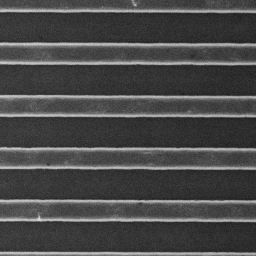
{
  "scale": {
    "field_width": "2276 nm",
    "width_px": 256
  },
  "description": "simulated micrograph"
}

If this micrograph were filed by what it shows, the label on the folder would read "parallel lines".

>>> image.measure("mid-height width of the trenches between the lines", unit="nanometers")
289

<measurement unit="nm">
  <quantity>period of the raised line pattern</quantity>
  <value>465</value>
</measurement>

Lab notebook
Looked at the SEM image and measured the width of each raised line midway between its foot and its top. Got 172 nanometres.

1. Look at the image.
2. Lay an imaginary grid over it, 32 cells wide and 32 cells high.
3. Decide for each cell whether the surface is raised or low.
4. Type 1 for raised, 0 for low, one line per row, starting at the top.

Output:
11111111111111111111111111111111
00000000000000000000000000000000
00000000000000000000000000000000
00000000000000000000000000000000
00000000000000000000000000000000
00000000000000000000000000000000
11111111111111111111111111111111
11111111111111111111111111111111
00000000000000000000000000000000
00000000000000000000000000000000
00000000000000000000000000000000
00000000000000000000000000000000
11111111111111111111111111111111
11111111111111111111111111111111
00000000000000000000000000011111
00000000000000000000000000000000
00000000000000000000000000000000
00000000000000000000000000000000
00000000000000000000000000000000
11111111111111111111111111111111
11111111111111111111111111111111
00000000000000000000000000000000
00000000000000000000000000000000
00000000000000000000000000000000
00000000000000000000000000000000
11111111111111111111111111111111
11111111111111111111111111111111
11111111111111011010111111111111
00000000000000000000000000000000
00000000000000000000000000000000
00000000000000000000000000000000
00000000000000000000000000000000